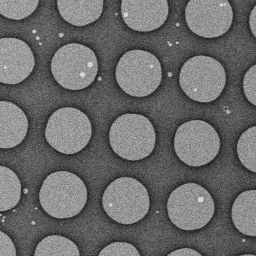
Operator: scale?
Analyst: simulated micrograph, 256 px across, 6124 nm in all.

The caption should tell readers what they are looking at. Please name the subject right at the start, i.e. an array of small figures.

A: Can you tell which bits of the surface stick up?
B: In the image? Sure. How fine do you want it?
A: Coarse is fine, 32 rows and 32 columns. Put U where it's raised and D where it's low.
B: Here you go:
UUUUUDDUUUUUUDDUUUUUUDDDUUUUUDDD
UUUUDDDUUUUUUDDUUUUUUDDUUUUUUDDU
DDDDDDDDUUUUDDDDUUUUUDDUUUUUUDDU
DDDDDDDDDDDDDDDDUUUUDDDDUUUUUDDU
DDDDDDDDDDDDDDDDDDDDDDDDDUUDDDDD
UUUDDDDDDUDDDDDDDDDDDDDDDDDDDDDD
UUUUDDDUUUUUDDDDUUDDDDDDDDDDDDDD
UUUUDDDUUUUUDDDUUUUUDDDDUUUDDDDD
UUUUDDUUUUUUDDDUUUUUDDDUUUUUDDDU
UUUDDDDUUUUUDDDUUUUUDDUUUUUUDDDU
DDDDDDDUUUUDDDDUUUUUDDDUUUUUDDUU
DDDDDDDDDDDDDDDDUUUDDDDUUUUUDDDU
DDDDDDDDDDDDDDDDDDDDDDDDUUUDDDDU
UUDDDDDDUDDDDDDDDDDDDDDDDDDDDDDD
UUUDDDUUUUUDDDDUUUDDDDDDDDDDDDDD
UUUDDDUUUUUDDDUUUUUDDDDUUUDDDDDD
UUUDDDUUUUUDDDUUUUUDDDUUUUUDDDDU
UUUDDDUUUUUDDDUUUUUDDDUUUUUDDDUU
DDDDDDDUUUDDDDUUUUUDDDUUUUUDDDUU
DDDDDDDDDDDDDDDUUUDDDDUUUUUDDDUU
DDDDDDDDDDDDDDDDDDDDDDDUUUDDDDUU
UUDDDDDUUDDDDDDDDDDDDDDDDDDDDDDD
UUDDDDUUUUDDDDUUUDDDDDDDDDDDDDDD
UUUDDUUUUUUDDUUUUUDDDDUUUDDDDDDD
UUUDDUUUUUUDDUUUUUUDDUUUUUDDDDUU
UUDDDUUUUUUDDUUUUUUDDUUUUUUDDUUU
DDDDDDUUUUDDDUUUUUDDDUUUUUUDDUUU
DDDDDDDDDDDDDDUUUDDDDUUUUUDDDUUU
DDDDDDDDDDDDDDDDDDDDDDDUUDDDDDUU
UDDDDDUDDDDDDDDDDDDDDDDDDDDDDDDD
UUDDDUUUUDDDDDUUDDDDDDDDDDDDDDDD
UUDDUUUUUUDDDUUUUDDDDDUUUDDDDDDD